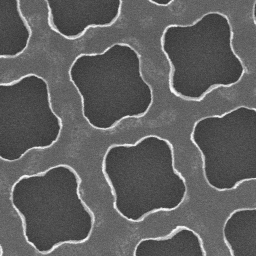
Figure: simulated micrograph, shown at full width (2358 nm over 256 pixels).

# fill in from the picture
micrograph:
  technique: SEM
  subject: holes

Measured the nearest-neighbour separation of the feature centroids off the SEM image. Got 885 nm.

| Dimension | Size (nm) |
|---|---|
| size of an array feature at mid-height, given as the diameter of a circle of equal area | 707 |